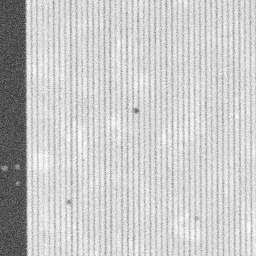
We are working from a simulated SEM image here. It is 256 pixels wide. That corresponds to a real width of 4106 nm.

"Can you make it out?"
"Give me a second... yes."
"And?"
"parallel lines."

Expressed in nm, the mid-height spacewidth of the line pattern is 28.1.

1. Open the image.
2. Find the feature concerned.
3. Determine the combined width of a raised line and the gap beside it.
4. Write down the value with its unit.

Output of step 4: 90 nm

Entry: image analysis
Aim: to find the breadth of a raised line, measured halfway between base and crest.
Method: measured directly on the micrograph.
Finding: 60.2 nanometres